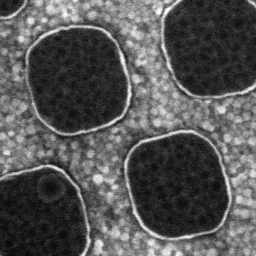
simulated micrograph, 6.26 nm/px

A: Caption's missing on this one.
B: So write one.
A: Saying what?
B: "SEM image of raised bodies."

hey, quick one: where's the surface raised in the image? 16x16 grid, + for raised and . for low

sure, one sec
+..........+++++
..........++++++
..+++++...++++++
..++++++..++++++
..++++++...+++++
..++++++...+++++
..++++++........
...++++.........
..........+++...
........++++++..
..++....++++++..
+++++...++++++..
+++++...++++++..
+++++....+++++..
++++++...++++...
+++++...........